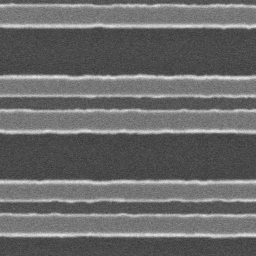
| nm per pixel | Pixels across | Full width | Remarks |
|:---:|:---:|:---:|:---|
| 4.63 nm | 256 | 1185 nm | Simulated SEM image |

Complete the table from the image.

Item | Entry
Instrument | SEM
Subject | lines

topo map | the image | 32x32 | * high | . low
********************************
********************************
********************************
................................
................................
................................
................................
................................
................................
................................
********************************
********************************
********************************
********************************
********************************
********************************
**..*..*.....**..**.............
................................
................................
................................
................................
................................
................................
********************************
********************************
********************************
********************************
********************************
********************************
................................
................................
................................